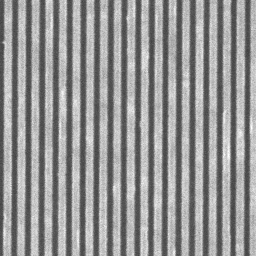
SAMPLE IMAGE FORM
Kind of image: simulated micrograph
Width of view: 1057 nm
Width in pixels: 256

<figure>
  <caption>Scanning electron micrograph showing parallel lines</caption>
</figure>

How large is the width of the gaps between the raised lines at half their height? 23.7 nm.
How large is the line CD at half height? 0.0356 um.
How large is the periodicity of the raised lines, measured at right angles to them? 56.5 nanometres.